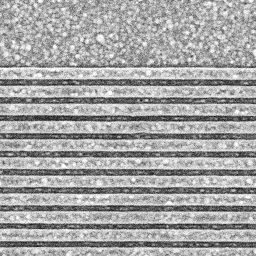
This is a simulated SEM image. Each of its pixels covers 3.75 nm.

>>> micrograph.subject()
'parallel lines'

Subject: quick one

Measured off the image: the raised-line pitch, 67.4 nanometres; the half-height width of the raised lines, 42.6 nm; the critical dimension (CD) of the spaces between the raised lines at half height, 25.3 nm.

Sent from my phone